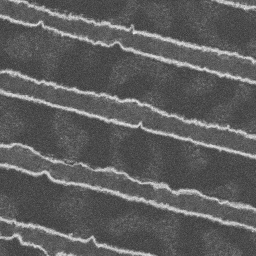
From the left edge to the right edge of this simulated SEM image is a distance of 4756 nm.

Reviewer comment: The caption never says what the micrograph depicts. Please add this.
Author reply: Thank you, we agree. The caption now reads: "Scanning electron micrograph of one or a few lines or trenches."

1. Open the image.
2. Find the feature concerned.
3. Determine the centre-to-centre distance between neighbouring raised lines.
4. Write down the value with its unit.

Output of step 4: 1330 nm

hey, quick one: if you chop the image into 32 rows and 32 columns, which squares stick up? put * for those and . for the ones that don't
...**************************...
......**************************
**.........*********************
******.........*****************
*********..........*************
*************.*........*********
*****************...........****
*********************...........
*************************.......
...**************************...
......**************************
..........**********************
****...........*****************
********...........*************
************..........**********
***************..........*******
*******************...........**
************************........
....***********************.....
.....**************************.
........************************
***............*****************
*******..........***************
************.........***********
***************..........*******
*******************..........***
***********************.........
.**************************.....
.....**************************.
........************************
****........********************
******..........****************